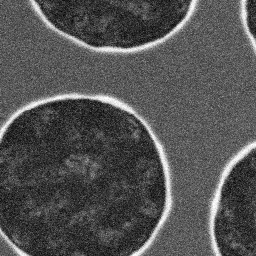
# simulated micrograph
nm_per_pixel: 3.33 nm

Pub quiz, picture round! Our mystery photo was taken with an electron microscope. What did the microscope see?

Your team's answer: holes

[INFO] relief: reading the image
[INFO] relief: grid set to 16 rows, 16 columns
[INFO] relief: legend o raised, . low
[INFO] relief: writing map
oo..........ooo.
ooo........oooo.
ooooo.....oooooo
oooooooooooooooo
oooooooooooooooo
oooooooooooooooo
ooo....ooooooooo
o........ooooooo
.........ooooooo
..........ooooo.
..........oooo..
..........oooo..
..........oooo..
..........ooo...
..........ooo...
o........ooooo..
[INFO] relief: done